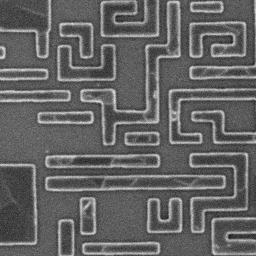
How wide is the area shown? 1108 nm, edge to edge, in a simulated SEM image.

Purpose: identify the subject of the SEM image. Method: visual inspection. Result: wiring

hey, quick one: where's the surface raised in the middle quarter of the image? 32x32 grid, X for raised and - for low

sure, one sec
XX-------XXXX--------XX---------
XXXXXXXXXXXXX--------XX---------
XXXXXXXXXXXXX--------XX---------
XXXXXXXXXXXXX--------XX---------
---------------------XX---------
---------------------XX---------
-----------X---------XX---------
X---XXXXXXXXX--------XX---XXXXXX
X---XXXXXXXXX--------XX---XXXXXX
---------XXXX--------XX---XXX---
----------XXX--------XX---XXX---
----------XXX--------XX----XX---
XXXXXXX---XXXXXXXXXXXXX----XX---
XXXXXXX---XXXXXXXXXXXXX----XX---
XXXXXXX---XXXXXXXXXXXXX----XX---
----------XXX--------------XX---
----------XXX--------------XX---
----------XXX---XXXXXXX----XXX--
----------XXX--XXXXXXXXX---XXXXX
----------XXX--XXXXXXXXX---XXXXX
--------------------------------
--------------------------------
--------------------------------
XXXXXXXXXXXXXXXXXXXXXXXX--------
XXXXXXXXXXXXXXXXXXXXXXXX--------
XXXXXXXXXXXX---XXXXXXXX---------
--------------------------------
--------------------------------
XXXXXXXXXXXXXXXXXXXXXXXXXXXXXXXX
XXXXXXXXXXXXXXXXXXXXXXXXXXXXXXXX
XXXXXXXXXXXXXXXXXXXXXXXXXXXXXXXX
XXXX----------------------------